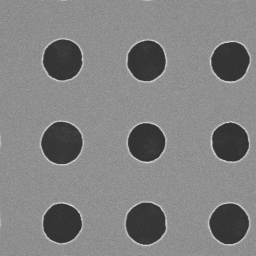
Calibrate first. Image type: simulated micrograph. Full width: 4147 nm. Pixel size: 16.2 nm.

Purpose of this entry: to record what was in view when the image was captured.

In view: a regular array of holes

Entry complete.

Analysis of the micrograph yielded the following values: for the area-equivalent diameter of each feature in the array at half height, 642 nanometres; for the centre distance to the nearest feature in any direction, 1310 nanometers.